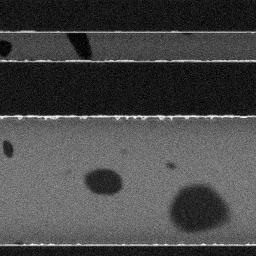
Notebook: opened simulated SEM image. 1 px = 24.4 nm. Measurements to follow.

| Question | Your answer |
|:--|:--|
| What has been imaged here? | lines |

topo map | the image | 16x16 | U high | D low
UUUUUUUUUUUUUUUU
UUUUUUUUUUUUUUUU
DDDDDDDDDDDDDDDD
DDDDDDDDDDDDDDDD
UUUUUUUUUUUUUUUU
UUUUUUUUUUUUUUUU
UUUUUUUUUUUUUUUU
DDDDDDDDDDDDDDDD
DDDDDDDDDDDDDDDD
DDDDDDDDDDDDDDDD
DDDDDDDDDDDDDDDD
DDDDDDDDDDDDDDDD
DDDDDDDDDDDDDDDD
DDDDDDDDDDDDDDDD
DDDDDDDDDDDDDDDD
UUUUUUUUUUUUUUUU